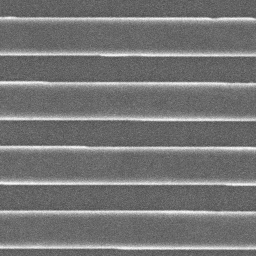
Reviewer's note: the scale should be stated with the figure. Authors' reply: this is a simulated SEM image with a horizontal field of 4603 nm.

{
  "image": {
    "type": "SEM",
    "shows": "lines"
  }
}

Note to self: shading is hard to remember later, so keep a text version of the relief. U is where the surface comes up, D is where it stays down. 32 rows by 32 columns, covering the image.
DDDDDDDDDDDDDDDDDDDDDDDDDDDDDDDD
DDDDDDDDDDDDDDDDDDDDDDDDDDDDDDDD
UUUUUUUUUUUUUUUUUUUUUUUUUUUUUUUU
UUUUUUUUUUUUUUUUUUUUUUUUUUUUUUUU
UUUUUUUUUUUUUUUUUUUUUUUUUUUUUUUU
UUUUUUUUUUUUUUUUUUUUUUUUUUUUUUUU
UUUUUUUUUUUUUUUUUUUUUUUUUUUUUUUU
DDDDDDDDDDDDDDDDDDDDDDDDDDDDDDDD
DDDDDDDDDDDDDDDDDDDDDDDDDDDDDDDD
DDDDDDDDDDDDDDDDDDDDDDDDDDDDDDDD
UUUUUUUUUUUUUUUUUUUUUUUUUUUUUUUU
UUUUUUUUUUUUUUUUUUUUUUUUUUUUUUUU
UUUUUUUUUUUUUUUUUUUUUUUUUUUUUUUU
UUUUUUUUUUUUUUUUUUUUUUUUUUUUUUUU
UUUUUUUUUUUUUUUUUUUUUUUUUUUUUUUU
DDDDDDDDDDDDDDDDDDDDDDDDDDDDDDDD
DDDDDDDDDDDDDDDDDDDDDDDDDDDDDDDD
DDDDDDDDDDDDDDDDDDDDDDDDDDDDDDDD
UUUUUUUUUUUUUUUUUUUUUUUUUUUUUUUD
UUUUUUUUUUUUUUUUUUUUUUUUUUUUUUUU
UUUUUUUUUUUUUUUUUUUUUUUUUUUUUUUU
UUUUUUUUUUUUUUUUUUUUUUUUUUUUUUUU
UUUUUUUUUUUUUUUUUUUUUUUUUUUUUUUU
DDDDDDDDDDDDDDDDDDDDDDDDDDDDDDDD
DDDDDDDDDDDDDDDDDDDDDDDDDDDDDDDD
DDDDDDDDDDDDDDDDDDDDDDDDDDDDDDDD
UUUUUUUUUUUUUUUUUUUUUUUDDDDDDDDD
UUUUUUUUUUUUUUUUUUUUUUUUUUUUUUUU
UUUUUUUUUUUUUUUUUUUUUUUUUUUUUUUU
UUUUUUUUUUUUUUUUUUUUUUUUUUUUUUUU
UUUUUUUUUUUUUUUUUUUUUUUUUUUUUUUU
DDDDDDDDDDDDDDDDDDDDDDDDDDDDDDDD